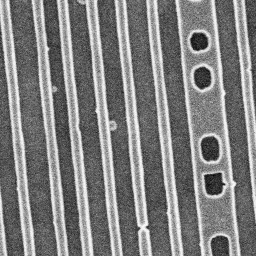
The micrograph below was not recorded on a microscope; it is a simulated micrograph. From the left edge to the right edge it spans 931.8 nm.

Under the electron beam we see parallel lines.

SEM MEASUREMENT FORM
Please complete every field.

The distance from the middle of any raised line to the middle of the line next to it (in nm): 106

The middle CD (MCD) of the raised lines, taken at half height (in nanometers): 32.1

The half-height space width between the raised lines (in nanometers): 73.8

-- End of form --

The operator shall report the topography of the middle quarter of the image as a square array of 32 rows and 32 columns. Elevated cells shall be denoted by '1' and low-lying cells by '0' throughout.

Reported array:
11000001110000011000001100000011
11000000110000011000001110000011
11000000110000011000000110000011
11000000110000011000000110000011
11000000110000011000000110000011
11100000110000011000000110000011
01100000110000011000000110000011
01100000110000011000000110000001
01100000110000011100000110000001
01100000110000001100000111000001
01100000110000001100000111000001
01100000111000001100000011000001
01100000111000001100000011000001
01100000011000001100000011000001
01110000011000001100000011000001
01100000011000001100000011000001
00110000011000001100000011000000
00110000011000001100000011000000
00110000011000001110000011000000
00110000011000001110000001000000
00110000011000001110000001000000
00110000001100000110000001100000
00110000001100000110000001100000
00111000001100000110000001100000
00011000001100000110000001100000
00011000001100000110000001100000
00011000001100000110000001100000
00011000001100000110000001100000
00011000001100000111000001100000
00011000001100000111000001100000
00011000001100000011000001100000
00011000000110000011000000110000